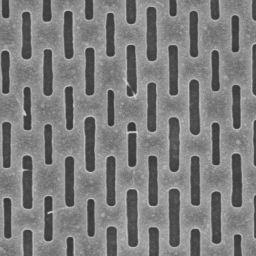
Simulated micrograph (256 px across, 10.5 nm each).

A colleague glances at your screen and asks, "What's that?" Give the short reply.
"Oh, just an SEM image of a regular array of holes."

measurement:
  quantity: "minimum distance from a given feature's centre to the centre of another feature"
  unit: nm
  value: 433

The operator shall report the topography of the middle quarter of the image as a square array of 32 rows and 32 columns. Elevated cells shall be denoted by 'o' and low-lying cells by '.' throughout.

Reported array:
ooooo...oooooooo..oooooooo...ooo
ooooo...oooooooo..oooooooo...ooo
ooooo...oooooooo..oooooooo...ooo
ooooo...oooooooo..oooooooo...ooo
ooooo...oooooooo..oooooooo...oo.
o.ooo...oooooooo..ooo..ooo...oo.
..ooo...ooo.oooo..ooo..ooo...oo.
..oooo.oooo..ooo..ooo..ooo..ooo.
..ooooooooo..oooooooo..oooooooo.
..ooooooooo.ooooooooo..oooooooo.
..ooooooooo..oooooooo..oooooooo.
..ooooooooo..oooooooo..oooooooo.
..ooooooooo..oooooooo..oooooooo.
..oooo..ooo..oooooooo..oooo.ooo.
..ooo...ooo..oooooooo..ooo...oo.
..ooo...ooo.oooo..ooo..ooo...oo.
ooooo...oooooooo..ooo..ooo...oo.
ooooo...oooooooo..oooooooo...ooo
ooooo...oooooooo..oooooooo...ooo
ooooo...oooooooo..oooooooo...ooo
ooooo...oooooooo..oooooooo...ooo
ooooo...oooooooo..oooooooo...ooo
ooooo...oooooooo..oooooooo...ooo
o.ooo...ooo..ooo..ooo..ooo...ooo
...oo...oo...ooo..ooo...oo...ooo
...oo...oo...ooo..ooo...oo...oo.
...ooo..oo...oooooooo...oo...oo.
...ooooooo...oooooooo...oooooooo
...ooooooo...oooooooo...oooooooo
...ooooooo...oooooooo...oooooooo
...ooooooo...oooooooo...oooooooo
...ooooooo...ooo..ooo...oo...ooo